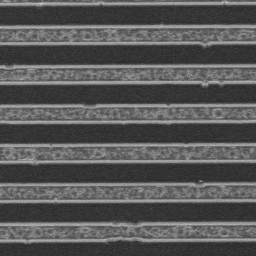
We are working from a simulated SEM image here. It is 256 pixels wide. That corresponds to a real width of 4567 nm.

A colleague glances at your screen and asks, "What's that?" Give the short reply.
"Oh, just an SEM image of parallel lines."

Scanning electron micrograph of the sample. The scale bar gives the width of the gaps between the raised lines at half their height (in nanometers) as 392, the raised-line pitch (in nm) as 703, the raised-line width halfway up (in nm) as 308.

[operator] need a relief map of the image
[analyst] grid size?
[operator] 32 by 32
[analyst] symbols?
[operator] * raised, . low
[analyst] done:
*************...................
................................
................................
********************************
********************************
.........................*......
................................
................................
********************************
********************************
................................
................................
................................
********************************
********************************
................................
................................
................................
********************************
********************************
................................
................................
................................
********************************
********************************
................................
................................
................................
********************************
********************************
................................
................................